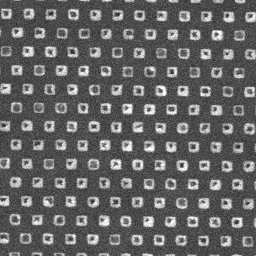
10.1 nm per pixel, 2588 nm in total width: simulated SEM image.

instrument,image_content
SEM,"a regular array of raised bodies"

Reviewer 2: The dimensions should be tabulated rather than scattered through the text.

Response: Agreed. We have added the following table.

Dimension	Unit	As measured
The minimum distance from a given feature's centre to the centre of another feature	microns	0.216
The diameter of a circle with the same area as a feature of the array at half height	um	0.106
